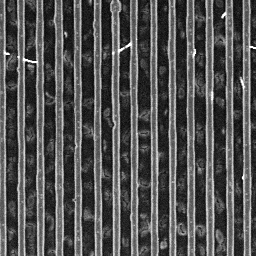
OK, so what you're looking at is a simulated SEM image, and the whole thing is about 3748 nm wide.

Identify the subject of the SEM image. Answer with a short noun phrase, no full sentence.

parallel lines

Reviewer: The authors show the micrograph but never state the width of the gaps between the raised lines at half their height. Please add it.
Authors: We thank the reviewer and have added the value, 0.196 microns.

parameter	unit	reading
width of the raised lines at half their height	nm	84.2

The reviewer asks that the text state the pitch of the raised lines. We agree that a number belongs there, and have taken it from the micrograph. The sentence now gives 275 nanometers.